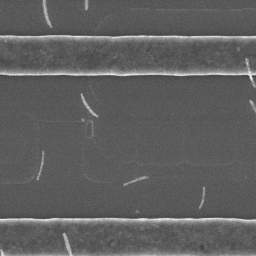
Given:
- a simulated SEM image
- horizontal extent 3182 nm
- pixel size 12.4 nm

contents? wiring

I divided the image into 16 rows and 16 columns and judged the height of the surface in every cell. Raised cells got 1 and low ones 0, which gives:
0000000000000000
0000000000000000
1111111111111111
1111111111111111
1111111111111111
0000000000000000
0000000000000000
0000000000000000
0000000000000000
0000000000000000
0000000000000000
0000000000000000
0000000000000000
0000000000000000
1111111111111111
1111111111111111